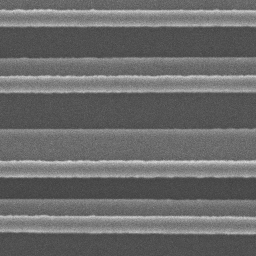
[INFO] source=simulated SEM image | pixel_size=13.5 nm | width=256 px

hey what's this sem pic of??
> lines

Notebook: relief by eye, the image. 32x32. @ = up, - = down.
@@@@@@@@@@@@@@@@@@@@@@@@@@@@@@@@
@@@@@@@@@@@@@@@@@@@@@@@@@@@@@@@@
@@@@@@@@@@@@@@@@@@@@@@@@@@@@@@@@
--------------------------------
--------------------------------
--------------------------------
--------------------------------
@@@@@@@@@@@@@@@@@@@@@@@@@@@@@@@@
@@@@@@@@@@@@@@@@@@@@@@@@@@@@@@@@
@@@@@@@@@@@@@@@@@@@@@@@@@@@@@@@@
@@@@@@@@@@@@@@@@@@@@@@@@@@@@@@@@
--------------------------------
--------------------------------
--------------------------------
--------------------------------
--------------------------------
@@@@@@@@@@@@@@@@@@@@@@@@@@@@@@@@
@@@@@@@@@@@@@@@@@@@@@@@@@@@@@@@@
@@@@@@@@@@@@@@@@@@@@@@@@@@@@@@@@
@@@@@@@@@@@@@@@@@@@@@@@@@@@@@@@@
@@@@@@@@@@@@@@@@@@@@@@@@@@@@@@@@
@@@@@@@@@@@@@@@@@@@@@@@@@@@@@@@@
--------------------------------
--------------------------------
--------------------------------
@@@@@@@@@@@@@@@@@@@@@@@@@@@@@@@@
@@@@@@@@@@@@@@@@@@@@@@@@@@@@@@@@
@@@@@@@@@@@@@@@@@@@@@@@@@@@@@@@@
@@@@@@@@@@@@@@@@@@@@@@@@@@@@@@@@
--------------------------------
--------------------------------
--------------------------------